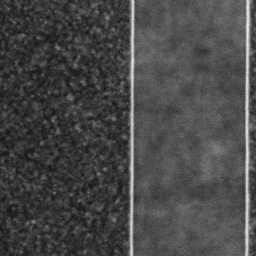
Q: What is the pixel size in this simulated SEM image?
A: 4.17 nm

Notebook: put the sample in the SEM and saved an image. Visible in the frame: one or a few lines or trenches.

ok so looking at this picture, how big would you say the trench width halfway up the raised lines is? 476 nm